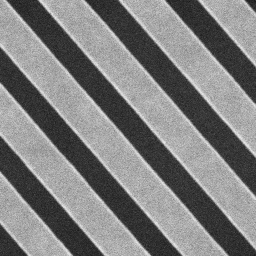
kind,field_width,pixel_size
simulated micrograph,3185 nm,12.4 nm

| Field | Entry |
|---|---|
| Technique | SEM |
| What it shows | lines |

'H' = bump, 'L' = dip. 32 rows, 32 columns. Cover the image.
HLLLLHHHHHHLLLLHHHHHHLLLLHHHHHHL
HHLLLLHHHHHHLLLLHHHHHHLLLLHHHHHH
HHHLLLLHHHHHHLLLLHHHHHHLLLLHHHHH
HHHHLLLLHHHHHHLLLLHHHHHHLLLLHHHH
HHHHHLLLLHHHHHLLLLLHHHHHLLLLLHHH
HHHHHHLLLLHHHHHLLLLLHHHHHLLLLLHH
LHHHHHLLLLHHHHHHLLLLLHHHHHLLLLHH
LHHHHHHLLLLHHHHHHLLLLHHHHHHLLLLH
LLHHHHHHLLLLHHHHHHLLLLHHHHHHLLLL
LLLHHHHHHLLLLHHHHHHLLLLHHHHHHLLL
LLLLHHHHHHLLLLHHHHHHLLLLHHHHHHLL
HLLLLHHHHHHLLLLHHHHHHLLLLHHHHHHL
HHLLLLHHHHHLLLLLHHHHHLLLLLHHHHHL
HHHLLLLHHHHHLLLLLHHHHHLLLLLHHHHH
HHHHLLLLHHHHHLLLLHHHHHHLLLLHHHHH
HHHHLLLLLHHHHHLLLLHHHHHHLLLLHHHH
HHHHHLLLLHHHHHHLLLLHHHHHHLLLLHHH
LHHHHHLLLLHHHHHHLLLLHHHHHHLLLLHH
LHHHHHHLLLLHHHHHHLLLLHHHHHHLLLLH
LLHHHHHHLLLLHHHHHHLLLLHHHHHHLLLL
LLLHHHHHHLLLLHHHHHLLLLLHHHHHLLLL
LLLLHHHHHHLLLLHHHHHLLLLHHHHHHLLL
HLLLLHHHHHHLLLLHHHHHLLLLHHHHHHLL
HHLLLLHHHHHLLLLHHHHHHLLLLHHHHHHL
HHLLLLLHHHHHLLLLHHHHHHLLLLHHHHHH
HHHLLLLHHHHHHLLLLHHHHHHLLLLHHHHH
HHHHLLLLHHHHHHLLLLHHHHHHLLLLHHHH
HHHHHLLLLHHHHHHLLLLHHHHHHLLLLHHH
LHHHHHLLLLHHHHHHLLLLHHHHHLLLLLHH
LHHHHHHLLLLHHHHHHLLLLHHHHHLLLLLH
LLHHHHHHLLLLHHHHHLLLLHHHHHHLLLLH
LLLHHHHHHLLLLHHHHHLLLLHHHHHHLLLL